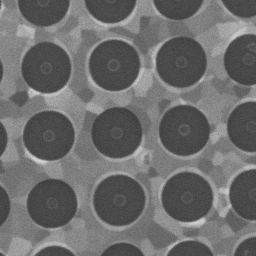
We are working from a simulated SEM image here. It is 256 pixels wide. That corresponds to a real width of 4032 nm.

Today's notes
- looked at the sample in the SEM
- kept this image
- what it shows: an array of small figures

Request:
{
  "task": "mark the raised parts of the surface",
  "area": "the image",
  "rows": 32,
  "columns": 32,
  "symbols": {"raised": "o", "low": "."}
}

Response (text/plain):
oo.......oo......oo.......oo....
oo.......oo......ooo.....oooo...
ooo.....oooo....oooooo.ooooooo..
oooo...ooooooooooooooooooooooooo
ooooooooooooooooooooooooooooo...
oooo...ooooo....oooo.....oooo...
ooo.....ooo......oo.......oo....
ooo......oo.......o.......oo....
ooo......oo.......o.......oo....
ooo......oo......ooo.....oooo...
ooo.....oooo.....ooo.....ooooo..
oooo...ooooooooooooooooooooooooo
ooooooooooooooooooooooooooooooo.
oooooooooooooo..ooooo....oooo...
oooo....oooo.....ooo......ooo...
ooo......ooo......oo......oo....
.oo......oo.......oo......oo....
.oo......oo.......oo......ooo...
.oo......ooo......oo.....ooooo..
oooo....ooooo...oooooo..oooooooo
oooooooooooooooooooooooooooooooo
oooooooooooooooooooooo...ooooo..
oooooo..ooooo....oooo.....ooo...
oooo.....ooo......oo.......oo...
.oo.......oo......oo.......o....
.oo.......oo......oo.......oo...
.oo.......oo......ooo.....ooo...
.ooo.....ooo.....ooooo...oooooo.
ooooo..ooooooo.ooooooooooooooooo
ooooooooooooooooooooooooooooooo.
oooooo.ooooooo...ooooo....oooo..
oooo.....oooo.....ooo......oo...